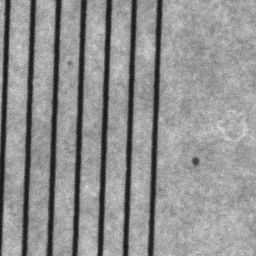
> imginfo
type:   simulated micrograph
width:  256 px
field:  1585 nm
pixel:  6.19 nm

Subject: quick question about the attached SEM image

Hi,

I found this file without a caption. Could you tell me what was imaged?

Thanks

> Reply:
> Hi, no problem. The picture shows parallel lines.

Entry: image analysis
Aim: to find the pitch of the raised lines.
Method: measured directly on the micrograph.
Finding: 156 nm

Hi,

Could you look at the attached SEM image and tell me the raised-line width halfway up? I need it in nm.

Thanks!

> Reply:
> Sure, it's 122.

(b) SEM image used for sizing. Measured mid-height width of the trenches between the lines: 33.3 nanometres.